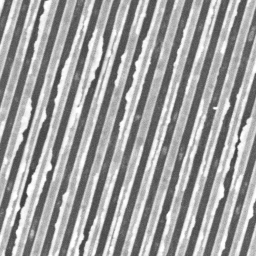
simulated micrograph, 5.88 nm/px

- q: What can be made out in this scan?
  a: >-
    parallel lines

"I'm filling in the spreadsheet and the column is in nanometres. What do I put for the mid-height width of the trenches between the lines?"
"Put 53.7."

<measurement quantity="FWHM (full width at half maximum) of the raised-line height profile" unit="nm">48.7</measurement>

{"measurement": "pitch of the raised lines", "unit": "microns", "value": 0.102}